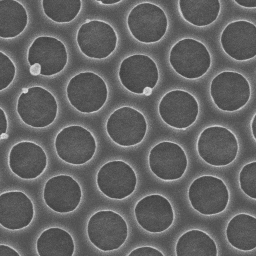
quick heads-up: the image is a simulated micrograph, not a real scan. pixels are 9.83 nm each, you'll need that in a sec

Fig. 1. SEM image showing a regular array of holes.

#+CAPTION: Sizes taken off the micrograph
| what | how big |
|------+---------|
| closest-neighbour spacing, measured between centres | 504 nanometres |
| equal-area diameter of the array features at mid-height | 386 nm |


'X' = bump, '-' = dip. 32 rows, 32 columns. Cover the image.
---XX-----XXX-XXX--XXX-----XXX--
---XXX----XXXXXX----XXX----XXXXX
---XXXX--XXXXXXX-----XX----XXXXX
---XXXXXXX----XX-----XXXXXXX----
--XXXXXXXX-----XX---XXXXXXXX----
XXXX----XX-----XXXXXXX---XXX----
XXXX----XX----XXXXXXX-----XX----
-XXX----XXXXXXXX---XX-----XXXXXX
--XXX---XXXXXXX-----XX----XXXXXX
--XXXXXXXX--XXX-----XXX--XX---XX
-XXXXXXXX----XX----XXXXXXX-----X
XXX---XX-----XXXX-XXX--XXX-----X
XX-----XX----XXXXXXX----XXX----X
XX-----XX----XX-XXXX-----XX---XX
-X-----XXXXXXX----XX-----XXXXXXX
-XX---XXXXXXX-----XXX---XXXXXXX-
-XXXXXXX---XX-----XXXXXXX----XXX
XXXXXXX-----XX----XXXXXXX-----XX
XX---XX-----XXXXXXX----XX-----XX
X-----X-----XXXXXXX----XX----XXX
X-----XXX-XXX---XXX----XXX--XXX-
XX---XXXXXXX-----XX----XXXXXXX--
XXXXXX---XXX-----XXXXXXX----XX--
XXXXXX----XX-----XXXXXXX----XX--
---XX-----XXX---XXX-XXXX-----XX-
----XX----XXXXXXX----XXX----XXXX
----XXX--XXX--XXX-----XXX--XXXXX
----XXXXXXX----XX-----XXXXXXX---
X--XXXXXXXX-----XX---XXXXXXX----
XXXXX----XX-----XXXXXXX---XX----
XXXXX----XXX---XXXXXXX-----XX---
--XXX----XXXXXXX----XX-----XXXXX